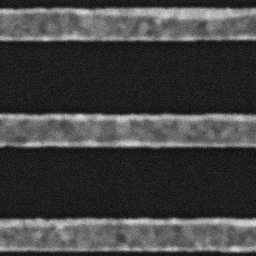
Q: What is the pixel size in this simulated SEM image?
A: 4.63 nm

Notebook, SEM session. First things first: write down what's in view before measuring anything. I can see lines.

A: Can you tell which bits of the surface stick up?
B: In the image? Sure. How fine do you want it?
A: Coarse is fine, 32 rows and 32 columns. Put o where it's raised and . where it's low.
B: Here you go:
................................
ooooooooooo.oooooooo..........oo
oooooooooooooooooooooooooooooooo
oooooooooooooooooooooooooooooooo
oooooooooooooooooooooooooooooooo
................................
................................
................................
................................
................................
................................
................................
................................
................................
ooo.............................
oooooooooooooooooooooooooooooooo
oooooooooooooooooooooooooooooooo
oooooooooooooooooooooooooooooooo
................................
................................
................................
................................
................................
................................
................................
................................
................................
................................
oooooooooooooooooooooooooooooooo
oooooooooooooooooooooooooooooooo
oooooooooooooooooooooooooooooooo
................................